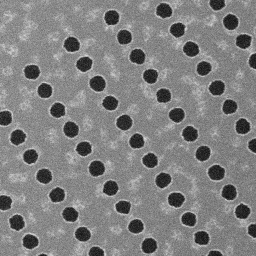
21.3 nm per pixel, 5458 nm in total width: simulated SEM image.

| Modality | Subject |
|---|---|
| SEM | a regular array of holes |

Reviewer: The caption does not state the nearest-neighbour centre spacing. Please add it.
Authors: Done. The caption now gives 23.2 pixels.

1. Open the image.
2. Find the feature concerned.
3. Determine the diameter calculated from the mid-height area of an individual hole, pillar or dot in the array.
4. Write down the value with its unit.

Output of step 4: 0.349 um